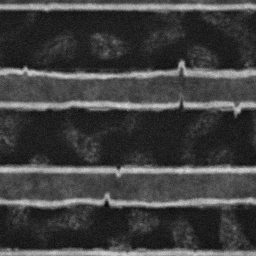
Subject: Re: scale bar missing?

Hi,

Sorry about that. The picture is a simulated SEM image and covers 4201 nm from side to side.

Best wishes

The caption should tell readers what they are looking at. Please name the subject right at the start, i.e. one or a few lines or trenches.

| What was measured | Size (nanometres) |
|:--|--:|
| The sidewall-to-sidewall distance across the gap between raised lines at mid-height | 1060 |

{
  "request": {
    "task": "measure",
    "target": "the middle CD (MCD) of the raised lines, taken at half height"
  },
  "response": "531 nm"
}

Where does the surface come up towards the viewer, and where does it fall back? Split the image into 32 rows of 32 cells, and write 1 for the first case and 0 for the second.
11111111111111111111111111111111
00000000000000000000000000000000
00000000000000000000000000000000
00000000000000000000000000000000
00000000000000000000000000000000
00000000000000000000000000000000
00000000000000000000000000000000
00000000000000000000000000000000
00000000000000000000001000000000
11111111010000111111111111111111
11111111111111111111111111111111
11111111111111111111111111111111
11111111111111111111111111111111
00000000000000000000000000000100
00000000000000000000000000000000
00000000000000000000000000000000
00000000000000000000000000000000
00000000000000000000000000000000
00000000000000000000000000000000
00000000000000000000000000000000
00000000000000000000000000000000
11111111111111111111111111111111
11111111111111111111111111111111
11111111111111111111111111111111
11111111111111111111111111111111
00000110000000000111110000000000
00000000000000000000000000000000
00000000000000000000000000000000
00000000000000000000000000000000
00000000000000000000000000000000
00000000000000000000000000000000
00000000000000000000000000000000